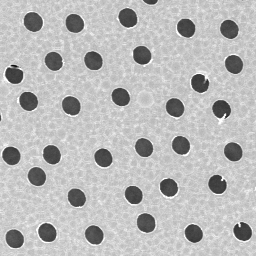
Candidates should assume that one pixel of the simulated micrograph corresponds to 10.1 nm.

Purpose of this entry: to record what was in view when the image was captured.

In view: a regular array of holes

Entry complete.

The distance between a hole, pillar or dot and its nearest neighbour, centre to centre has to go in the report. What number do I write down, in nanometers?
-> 365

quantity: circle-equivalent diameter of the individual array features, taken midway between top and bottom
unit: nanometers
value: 188